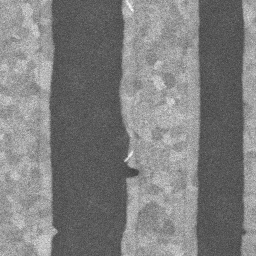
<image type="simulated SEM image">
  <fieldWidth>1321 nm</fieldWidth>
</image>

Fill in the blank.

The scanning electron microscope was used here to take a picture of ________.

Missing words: one or a few lines or trenches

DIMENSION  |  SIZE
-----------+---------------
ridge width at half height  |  0.324 um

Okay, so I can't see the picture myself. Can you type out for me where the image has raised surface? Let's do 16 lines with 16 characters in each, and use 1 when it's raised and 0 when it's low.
1110000011110000
1110000011110000
1110000011110000
1110000011110000
1110000011110000
1110000011110000
1110000011110000
1110000011110000
1110000011110000
1110000011110000
1110000011110000
1110000011110000
1110000011110000
1110000011110000
1110000011110000
1110000011110000